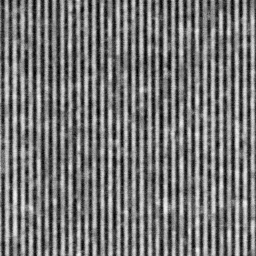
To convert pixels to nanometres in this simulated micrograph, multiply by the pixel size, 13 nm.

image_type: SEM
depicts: parallel lines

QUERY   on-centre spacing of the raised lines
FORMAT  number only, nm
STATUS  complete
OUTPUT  103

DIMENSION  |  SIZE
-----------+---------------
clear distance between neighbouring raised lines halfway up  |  66.6 nm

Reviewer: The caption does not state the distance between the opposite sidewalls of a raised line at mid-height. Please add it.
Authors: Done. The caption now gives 32.5 nanometres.